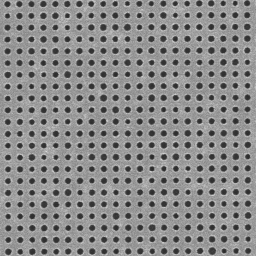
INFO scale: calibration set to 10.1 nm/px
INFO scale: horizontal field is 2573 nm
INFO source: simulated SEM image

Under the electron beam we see a regular array of holes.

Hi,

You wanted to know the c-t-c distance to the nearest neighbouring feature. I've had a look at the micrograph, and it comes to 118 nanometres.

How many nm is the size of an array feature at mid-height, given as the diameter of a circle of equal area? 61.1